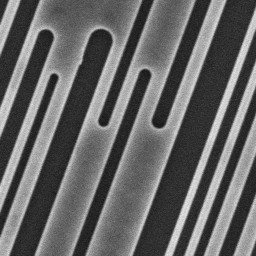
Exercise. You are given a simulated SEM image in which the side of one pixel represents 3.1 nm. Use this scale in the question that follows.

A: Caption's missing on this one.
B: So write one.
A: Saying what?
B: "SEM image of groups of lines, slits or small figures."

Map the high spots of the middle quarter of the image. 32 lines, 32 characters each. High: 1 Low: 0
11100000001110000111111111100001
11100000001110001110011111000001
11100000011110001100001111000011
11000000011100011100001111000011
11000000011100011100011110000111
11000000111100011100011110000111
11000000111000111000011110000111
10000000111000111000111100001111
10000001111000111000111100001111
00000001110001110001111000001110
00000011110001110001111000011110
00000011100001100001111000011110
00000011100011100011110000111100
00000111100011100011110000111100
00000111000111000011110000111000
00000111101111000111110001111000
00001111111110000111111111111000
00001111111110000111111111110000
00011111111110001111111111110000
00011111111100001111111111100000
00011111111100001111111111100000
00111111111100011111111111100000
00111111111000011111111111000000
00111111111000111111111111000000
01111111111000111111111111000000
01111111110000111111111110000000
01111111110001111111111110000000
11111111100001111111111110000000
11111111100001111111111100000000
11111111100011111111111100000000
11111111000011111111111000000000
11111111000111111111111000000001